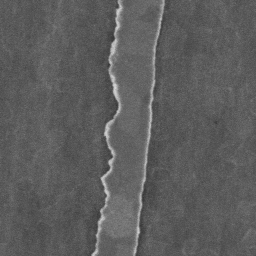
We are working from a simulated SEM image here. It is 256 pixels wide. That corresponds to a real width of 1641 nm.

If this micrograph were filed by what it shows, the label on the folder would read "one or a few lines or trenches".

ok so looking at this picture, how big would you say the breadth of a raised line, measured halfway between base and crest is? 259 nm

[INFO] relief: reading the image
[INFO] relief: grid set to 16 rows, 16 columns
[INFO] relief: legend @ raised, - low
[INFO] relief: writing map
-------@@@------
-------@@@------
-------@@@------
-------@@@------
-------@@@------
-------@@@------
-------@@-------
-------@@-------
-------@@-------
-------@@-------
-------@@-------
------@@@-------
-------@@-------
------@@@-------
------@@@-------
------@@@-------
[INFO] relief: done